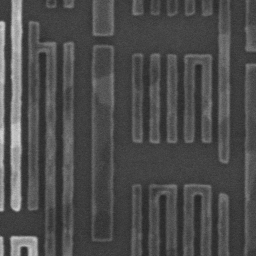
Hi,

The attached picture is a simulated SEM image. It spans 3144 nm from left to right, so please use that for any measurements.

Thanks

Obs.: wiring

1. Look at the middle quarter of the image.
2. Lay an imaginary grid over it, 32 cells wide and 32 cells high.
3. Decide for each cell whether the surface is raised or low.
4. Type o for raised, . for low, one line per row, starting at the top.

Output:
oo.....ooooo.....ooo..oo..oo..oo
oo.....ooooo.....oo...oo..oo..oo
oo.....ooooo.....oo...oo..oo..oo
oo.....ooooo.....oo...oo..oo..oo
oo.....ooooo.....ooo..oo..oo..oo
oo.....ooooo.....ooo..oo..oo..oo
oo.....ooooo.....ooo..oo..oo..oo
oo.....ooooo.....ooo..oo..oo..oo
oo.....ooooo.....ooo..oo..oo..oo
oo.....ooooo.....oo...oo..oo..oo
oo.....ooooo.....oo...oo..oo..oo
oo.....ooooo.....oo...oo..oo..oo
oo.....ooooo.....oo...oo..oo..oo
oo.....ooooo.....oo...oo..oo..oo
oo.....ooooo.....oo...oo..oo..oo
oo.....ooooo.....oo...oo..oo..oo
oo.....ooooo.....oo...oo..oo..oo
oo.....ooooo.....ooo..oo..oo..oo
oo.....ooooo.....oo...oo..oo..oo
oo.....ooooo..........oo...o....
oo.....ooooo....................
oo.....ooooo....................
oo.....ooooo....................
oo.....ooooo....................
oo.....ooooo....................
oo.....ooooo....................
oo.....ooooo....................
oo.....ooooo....................
oo.....ooooo....................
oo.....ooooo....................
oo.....ooooo......o...o...oo..oo
oo.....ooooo.....oo...oooooo..oo